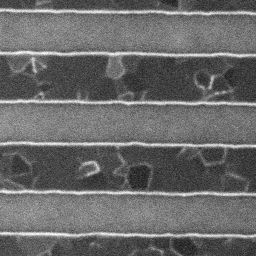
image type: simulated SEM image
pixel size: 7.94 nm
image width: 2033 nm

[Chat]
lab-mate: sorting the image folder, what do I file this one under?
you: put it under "wiring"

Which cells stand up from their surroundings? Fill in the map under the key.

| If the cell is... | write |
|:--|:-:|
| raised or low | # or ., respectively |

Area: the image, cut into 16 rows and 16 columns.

################
................
................
################
################
################
...............#
................
................
################
################
################
................
................
................
################